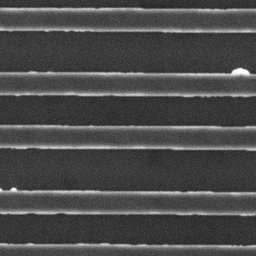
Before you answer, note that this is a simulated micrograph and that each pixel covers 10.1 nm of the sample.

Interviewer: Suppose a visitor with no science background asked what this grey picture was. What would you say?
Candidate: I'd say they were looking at lines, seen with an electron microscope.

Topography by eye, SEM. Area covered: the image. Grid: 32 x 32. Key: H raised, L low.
LLLLLLLLLLLLLLLLLLLLLLLLLLLLLLLL
HHHHHHHHHHHHHHHHHHHHHHHHHHHHHHHH
HHHHHHHHHHHHHHHHHHHHHHHHHHHHHHHH
HHHHHHHHHHHHHHHHHHHHHHHHHHHHHHHH
LLLLLLLLLLLLLLLLLLLLLLLLLLLLLLLL
LLLLLLLLLLLLLLLLLLLLLLLLLLLLLLLL
LLLLLLLLLLLLLLLLLLLLLLLLLLLLLLLL
LLLLLLLLLLLLLLLLLLLLLLLLLLLLLLLL
LLLLLLLLLLLLLLLLLLLLLLLLLLLLLLLL
HHHHHHHHHHHHHHHHHHHHHHHHHHHHHHHH
HHHHHHHHHHHHHHHHHHHHHHHHHHHHHHHH
HHHHHHHHHHHHHHHHHHHHHHHHHHHHHHHH
LLLLLLLLLLLLLLLLLLLLLLLLLLLLLLLL
LLLLLLLLLLLLLLLLLLLLLLLLLLLLLLLL
LLLLLLLLLLLLLLLLLLLLLLLLLLLLLLLL
LLLLLLLLLLLLLLLLLLLLLLLLLLLLLLLL
HHHHHHHHHHHHHHHHHHHHHHHHHHHHHHHH
HHHHHHHHHHHHHHHHHHHHHHHHHHHHHHHH
LLHHLLHHHHHHHHHHHHHHHHHHHHHHHHHH
LLLLLLLLLLLLLLLLLLLLLLLLLLLLLLLL
LLLLLLLLLLLLLLLLLLLLLLLLLLLLLLLL
LLLLLLLLLLLLLLLLLLLLLLLLLLLLLLLL
LLLLLLLLLLLLLLLLLLLLLLLLLLLLLLLL
LLLLLLLLLLLLLLLLLLLLLLLLLLLLLLLL
HHHHHHHHHHHHHHHHHHHHHHHHHHHHHHHH
HHHHHHHHHHHHHHHHHHHHHHHHHHHHHHHH
HHHHHHHHHHHHHHHHHHHHHHHHHHHHHHHH
LLLLLLLLLLLLLLLLLLLLLLLLLLLLLLLL
LLLLLLLLLLLLLLLLLLLLLLLLLLLLLLLL
LLLLLLLLLLLLLLLLLLLLLLLLLLLLLLLL
LLLLLLLLLLLLLLLLLLLLLLLLLLLLLLLL
HHHHHHHHHHHHHHHHHHHHHHHHHHHHHHHH